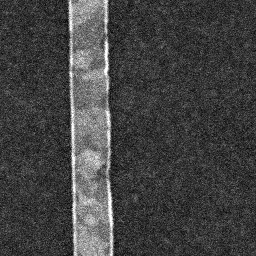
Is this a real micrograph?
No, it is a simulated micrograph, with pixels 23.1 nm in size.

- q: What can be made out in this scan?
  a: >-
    one or a few lines or trenches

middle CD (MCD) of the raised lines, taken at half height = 832 nm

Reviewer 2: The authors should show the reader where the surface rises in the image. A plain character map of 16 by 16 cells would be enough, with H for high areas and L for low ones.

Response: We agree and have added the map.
LLLLHHHLLLLLLLLL
LLLLHHHLLLLLLLLL
LLLLHHHLLLLLLLLL
LLLLHHHLLLLLLLLL
LLLLHHHLLLLLLLLL
LLLLHHHLLLLLLLLL
LLLLLHHLLLLLLLLL
LLLLLHHLLLLLLLLL
LLLLLHHLLLLLLLLL
LLLLLHHLLLLLLLLL
LLLLLHHLLLLLLLLL
LLLLLHHLLLLLLLLL
LLLLLHHLLLLLLLLL
LLLLLHHLLLLLLLLL
LLLLLHHLLLLLLLLL
LLLLLHHLLLLLLLLL